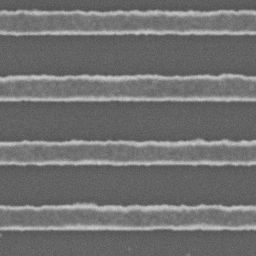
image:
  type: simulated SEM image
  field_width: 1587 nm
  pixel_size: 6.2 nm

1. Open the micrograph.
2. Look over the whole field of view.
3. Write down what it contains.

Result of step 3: lines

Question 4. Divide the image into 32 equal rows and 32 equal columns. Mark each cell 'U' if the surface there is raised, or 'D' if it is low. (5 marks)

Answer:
DDDDDDDDDDDDDDDDDDDDDDDDDDDDDDDD
UDUUDUUUUUUUDDUUUUUUUDUUUDUUUUUU
UUUUUUUUUUUUUUUUUUUUUUUUUUUUUUUU
UUUUUUUUUUUUUUUUUUUUUUUUUUUUUUUU
DDDDDDDDDDDDDDDDDDDDDDDDDDDDDDDD
DDDDDDDDDDDDDDDDDDDDDDDDDDDDDDDD
DDDDDDDDDDDDDDDDDDDDDDDDDDDDDDDD
DDDDDDDDDDDDDDDDDDDDDDDDDDDDDDDD
DDDDDDDDDDDDDDDDDDDDDDDDDDDDDDDD
DDDDDDDDDDDDDDDDDUDUDDDDDUDDUUDD
UUUUUUUUUUUUUUUUUUUUUUUUUUUUUUUU
UUUUUUUUUUUUUUUUUUUUUUUUUUUUUUUU
UUUDUUUUUDDUUUDDDDDDDDUUDUDUUDUU
DDDDDDDDDDDDDDDDDDDDDDDDDDDDDDDD
DDDDDDDDDDDDDDDDDDDDDDDDDDDDDDDD
DDDDDDDDDDDDDDDDDDDDDDDDDDDDDDDD
DDDDDDDDDDDDDDDDDDDDDDDDDDDDDDDD
DDDDDDDDDDDDDDDDDDDDDDDDDDDDDDDD
UUUUUUUUUUUUUUUUUUUUUUUUUUUUUUUU
UUUUUUUUUUUUUUUUUUUUUUUUUUUUUUUU
UUUUUUUUUUUUUUUUUUUUUUUUUUUUUUUU
DDDDDDDDDDDDDDDDDDDDDDDDDDDDDDDD
DDDDDDDDDDDDDDDDDDDDDDDDDDDDDDDD
DDDDDDDDDDDDDDDDDDDDDDDDDDDDDDDD
DDDDDDDDDDDDDDDDDDDDDDDDDDDDDDDD
DDDDDDDDDDDDDDDDDDDDDDDDDDDDDDDD
UUUUUUUUUUUUUUUUUUUUUUUUUUUUUUUU
UUUUUUUUUUUUUUUUUUUUUUUUUUUUUUUU
UUUUUUUUUUUUUUUUUUUUUUUUUUUUUUUU
DDDDDDDDDDDDDDDDDDDDDDDDDDDDDDDD
DDDDDDDDDDDDDDDDDDDDDDDDDDDDDDDD
DDDDDDDDDDDDDDDDDDDDDDDDDDDDDDDD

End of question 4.